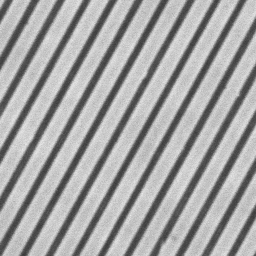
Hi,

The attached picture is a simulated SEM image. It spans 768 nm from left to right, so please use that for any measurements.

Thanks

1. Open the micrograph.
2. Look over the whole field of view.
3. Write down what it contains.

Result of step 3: parallel lines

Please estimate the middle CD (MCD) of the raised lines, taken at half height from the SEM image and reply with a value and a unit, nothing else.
46.4 nanometers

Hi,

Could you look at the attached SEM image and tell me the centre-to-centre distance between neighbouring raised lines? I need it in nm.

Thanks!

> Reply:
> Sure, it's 68.3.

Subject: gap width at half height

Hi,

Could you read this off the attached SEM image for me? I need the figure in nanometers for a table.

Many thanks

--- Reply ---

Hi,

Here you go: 21.7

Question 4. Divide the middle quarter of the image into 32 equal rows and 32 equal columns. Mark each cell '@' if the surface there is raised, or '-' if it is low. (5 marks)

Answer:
@@--@@@@---@@@@--@@@@@--@@@@--@@
@---@@@@--@@@@@--@@@@--@@@@---@@
@--@@@@---@@@@--@@@@@--@@@@--@@@
---@@@@--@@@@---@@@@--@@@@---@@@
--@@@@---@@@@--@@@@---@@@@--@@@@
--@@@@--@@@@---@@@@--@@@@--@@@@@
-@@@@--@@@@@--@@@@--@@@@@--@@@@-
@@@@@--@@@@--@@@@@--@@@@--@@@@@-
@@@@--@@@@@--@@@@--@@@@@--@@@@--
@@@@--@@@@--@@@@@--@@@@--@@@@---
@@@--@@@@@--@@@@--@@@@---@@@@--@
@@---@@@@--@@@@---@@@@--@@@@---@
@@--@@@@---@@@@--@@@@---@@@@--@@
@---@@@@--@@@@---@@@@--@@@@--@@@
@--@@@@---@@@@--@@@@--@@@@@--@@@
---@@@@--@@@@--@@@@@--@@@@--@@@@
--@@@@--@@@@@--@@@@--@@@@@--@@@@
-@@@@@--@@@@--@@@@@--@@@@--@@@@@
-@@@@--@@@@@--@@@@--@@@@@--@@@@-
@@@@@--@@@@--@@@@---@@@@--@@@@@-
@@@@--@@@@---@@@@--@@@@---@@@@--
@@@---@@@@--@@@@---@@@@--@@@@@--
@@@--@@@@---@@@@--@@@@--@@@@@--@
@@---@@@@--@@@@--@@@@@--@@@@---@
@@--@@@@--@@@@@--@@@@--@@@@@--@@
@--@@@@@--@@@@--@@@@@--@@@@---@@
@--@@@@--@@@@@--@@@@--@@@@@--@@@
--@@@@@--@@@@--@@@@@--@@@@--@@@@
--@@@@--@@@@@--@@@@--@@@@---@@@@
-@@@@@--@@@@--@@@@---@@@@--@@@@-
@@@@@--@@@@---@@@@--@@@@---@@@@-
@@@@---@@@@--@@@@--@@@@@--@@@@--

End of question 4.